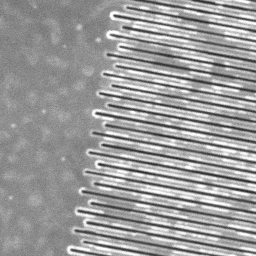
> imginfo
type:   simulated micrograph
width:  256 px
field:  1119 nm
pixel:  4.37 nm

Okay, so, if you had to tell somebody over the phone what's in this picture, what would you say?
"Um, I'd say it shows parallel lines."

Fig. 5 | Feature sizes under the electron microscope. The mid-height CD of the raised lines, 30.1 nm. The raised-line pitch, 43.4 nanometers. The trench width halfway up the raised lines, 12.8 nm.